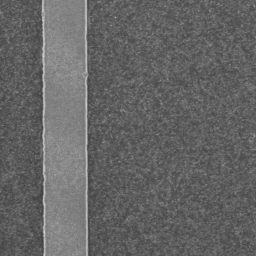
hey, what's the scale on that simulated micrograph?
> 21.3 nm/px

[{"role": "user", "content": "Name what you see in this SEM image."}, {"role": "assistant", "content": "one or a few lines or trenches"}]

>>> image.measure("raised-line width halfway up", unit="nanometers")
921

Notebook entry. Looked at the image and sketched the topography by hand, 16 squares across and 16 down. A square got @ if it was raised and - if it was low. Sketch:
---@@-----------
---@@-----------
---@@-----------
---@@-----------
---@@-----------
---@@-----------
---@@-----------
---@@-----------
---@@-----------
---@@-----------
---@@-----------
---@@-----------
---@@-----------
---@@-----------
---@@-----------
---@@-----------